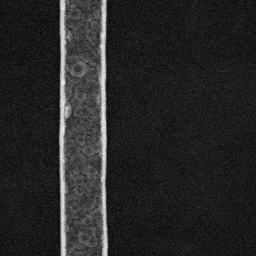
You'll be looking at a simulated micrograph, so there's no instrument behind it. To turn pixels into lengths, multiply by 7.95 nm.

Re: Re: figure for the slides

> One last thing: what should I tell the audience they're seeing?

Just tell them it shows one or a few lines or trenches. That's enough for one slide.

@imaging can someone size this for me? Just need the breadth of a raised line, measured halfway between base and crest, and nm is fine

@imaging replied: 345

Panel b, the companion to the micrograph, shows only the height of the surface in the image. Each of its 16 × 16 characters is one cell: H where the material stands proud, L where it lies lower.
LLLLHHHLLLLLLLLL
LLLLHHHLLLLLLLLL
LLLLHHHLLLLLLLLL
LLLLHHLLLLLLLLLL
LLLLHHLLLLLLLLLL
LLLLHHLLLLLLLLLL
LLLLHHLLLLLLLLLL
LLLLHHHLLLLLLLLL
LLLLHHHLLLLLLLLL
LLLLHHHLLLLLLLLL
LLLLHHHLLLLLLLLL
LLLLHHHLLLLLLLLL
LLLLHHHLLLLLLLLL
LLLLHHHLLLLLLLLL
LLLLHHHLLLLLLLLL
LLLLHHHLLLLLLLLL